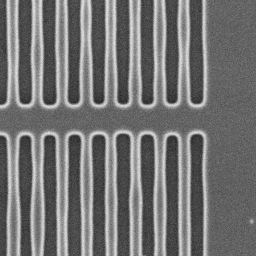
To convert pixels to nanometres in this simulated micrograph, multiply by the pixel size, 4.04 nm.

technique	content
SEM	groups of lines, slits or small figures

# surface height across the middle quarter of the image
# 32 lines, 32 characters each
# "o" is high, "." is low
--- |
o...ooo....oo....oo....oo....oo.
o...ooo....oo....oo....oo....oo.
o...ooo...ooo....oo....oo....oo.
o...ooo...ooo....oo....oo....oo.
o...ooo...ooo....oo....oo....oo.
o...ooo...ooo....oo....oo....oo.
o...ooo...ooo....oo....oo....oo.
o...ooo...ooo....oo....oo....oo.
o...ooo...ooo....oo....oo....oo.
o...ooo...ooo...ooo....ooo..oooo
oooooooooooooooooooo.ooooooooooo
oooooooooooooooooooooooooooooooo
oooooooooooooooooooooooooooooooo
oooooooooooooooooooooooooooooooo
oooooooooooooooooooooooooooooooo
oooooooooooooooooooooooooooooooo
oooooooooooooooooooooooooooooooo
oo..oooo..ooo...oooo..oooooooooo
o...ooo...ooo....oo....ooo...oo.
o....oo....oo....oo....oo....oo.
o....oo....oo....oo....oo....oo.
o....oo....oo....oo....oo....oo.
o....oo....oo....oo....oo....oo.
o....oo....oo....oo....oo....oo.
o...ooo....oo....oo....oo....oo.
o...ooo....oo....oo....oo....oo.
o...ooo....oo....oo....oo....oo.
o...ooo....oo....oo....oo....oo.
o...ooo....oo....oo....oo....oo.
o...ooo....oo....oo....oo....oo.
o...ooo....oo....oo....oo....oo.
o...ooo....oo....oo....oo....oo.